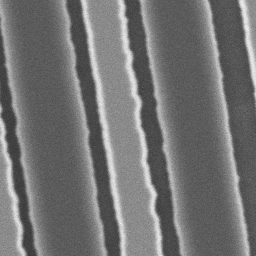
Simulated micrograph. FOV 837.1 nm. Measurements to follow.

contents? lines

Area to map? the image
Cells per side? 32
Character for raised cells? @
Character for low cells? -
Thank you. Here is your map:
@@@@@@@@--@@@@@---@@@@@@@@----@@
@@@@@@@@---@@@@---@@@@@@@@----@@
@@@@@@@@@--@@@@@--@@@@@@@@----@@
@@@@@@@@@--@@@@@--@@@@@@@@@----@
@@@@@@@@@--@@@@@--@@@@@@@@@----@
@@@@@@@@@--@@@@@--@@@@@@@@@----@
-@@@@@@@@--@@@@@--@@@@@@@@@----@
-@@@@@@@@--@@@@@---@@@@@@@@----@
-@@@@@@@@---@@@@---@@@@@@@@-----
-@@@@@@@@@--@@@@@--@@@@@@@@@----
-@@@@@@@@@--@@@@@--@@@@@@@@@----
-@@@@@@@@@--@@@@@--@@@@@@@@@----
--@@@@@@@@--@@@@@---@@@@@@@@----
--@@@@@@@@--@@@@@---@@@@@@@@----
--@@@@@@@@@--@@@@---@@@@@@@@----
--@@@@@@@@@--@@@@---@@@@@@@@----
@-@@@@@@@@@--@@@@@--@@@@@@@@@---
@-@@@@@@@@@--@@@@@---@@@@@@@@---
@--@@@@@@@@--@@@@@--@@@@@@@@@---
@--@@@@@@@@---@@@@---@@@@@@@@---
@--@@@@@@@@---@@@@---@@@@@@@@---
@--@@@@@@@@@--@@@@---@@@@@@@@@--
@--@@@@@@@@@--@@@@@--@@@@@@@@@--
@@-@@@@@@@@@--@@@@@--@@@@@@@@@--
@@--@@@@@@@@--@@@@@---@@@@@@@@--
@@--@@@@@@@@--@@@@@---@@@@@@@@--
@@--@@@@@@@@---@@@@---@@@@@@@@--
@@--@@@@@@@@---@@@@@--@@@@@@@@--
@@@-@@@@@@@@@--@@@@@--@@@@@@@@@-
@@@-@@@@@@@@@--@@@@@--@@@@@@@@@-
@@@-@@@@@@@@@--@@@@@---@@@@@@@@-
@@@--@@@@@@@@--@@@@@---@@@@@@@@-